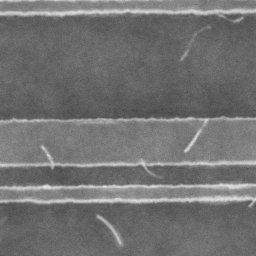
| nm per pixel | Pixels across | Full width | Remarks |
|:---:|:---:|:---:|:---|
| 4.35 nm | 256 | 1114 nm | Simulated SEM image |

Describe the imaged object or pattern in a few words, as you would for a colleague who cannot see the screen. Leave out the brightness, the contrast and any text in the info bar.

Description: lines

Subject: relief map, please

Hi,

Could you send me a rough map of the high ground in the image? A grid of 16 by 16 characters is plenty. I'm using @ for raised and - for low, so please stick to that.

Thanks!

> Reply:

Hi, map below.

@@@@@@@@@@@@@@@@
----------------
----------------
----------------
----------------
----------------
----------------
------@@@@@@@@@@
@@@@@@@@@@@@@@@@
@@@@@@@@@@@@@@@@
@@@@@@@@@@@@@@@@
@@@@@@@@@@@@@@@@
@@@@@@@-@@------
----------------
----------------
----------------